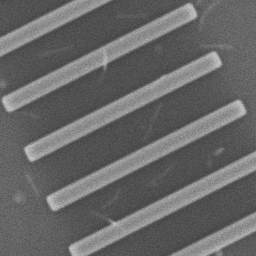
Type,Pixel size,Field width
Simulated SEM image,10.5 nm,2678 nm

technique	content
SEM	groups of lines, slits or small figures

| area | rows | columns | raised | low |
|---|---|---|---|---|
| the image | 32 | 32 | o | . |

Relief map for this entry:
........ooooo...................
......ooooo...........oo........
.....oooo...........oooo........
...oooo...........oooo..........
ooooo..........ooooo............
ooo...........oooo..............
o...........oooo................
..........oooo...........oo.....
........oooo..........ooooo.....
......oooo..........ooooo.......
....oooo...........oooo.........
..oooo...........oooo...........
oooo...........oooo.............
.o...........oooo...........ooo.
...........oooo...........oooo..
.........oooo...........oooo....
.......oooo...........oooo......
.....oooo...........oooo........
...oooo...........oooo..........
...oo...........oooo...........o
..............oooo...........ooo
............ooooo..........ooooo
..........oooo...........oooo...
........oooo...........oooo.....
......oooo...........ooooo......
......ooo..........ooooo........
.................ooooo..........
...............oooo...........oo
.............ooooo..........oooo
...........ooooo..........ooooo.
.........ooooo..........ooooo...
.........ooo..........ooooo.....